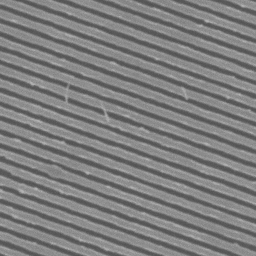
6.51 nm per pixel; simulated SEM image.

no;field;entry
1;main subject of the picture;parallel lines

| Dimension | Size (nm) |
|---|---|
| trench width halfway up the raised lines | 35.3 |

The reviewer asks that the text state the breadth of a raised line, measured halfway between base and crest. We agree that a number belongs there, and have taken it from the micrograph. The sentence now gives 52.2 nanometres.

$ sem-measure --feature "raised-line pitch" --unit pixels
13.1